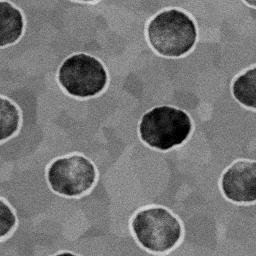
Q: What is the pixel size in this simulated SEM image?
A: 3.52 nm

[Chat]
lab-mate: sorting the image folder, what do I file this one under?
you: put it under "holes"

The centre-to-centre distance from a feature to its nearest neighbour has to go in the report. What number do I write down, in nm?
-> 343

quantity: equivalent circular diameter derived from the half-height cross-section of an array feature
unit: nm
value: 168